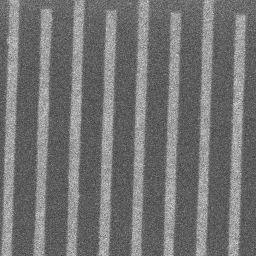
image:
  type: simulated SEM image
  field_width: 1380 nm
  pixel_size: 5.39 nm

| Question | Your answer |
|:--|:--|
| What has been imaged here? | parallel lines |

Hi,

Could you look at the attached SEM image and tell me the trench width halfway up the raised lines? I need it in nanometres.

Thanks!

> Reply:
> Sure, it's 115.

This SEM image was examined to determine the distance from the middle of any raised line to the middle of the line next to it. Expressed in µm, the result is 0.175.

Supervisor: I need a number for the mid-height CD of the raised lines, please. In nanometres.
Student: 62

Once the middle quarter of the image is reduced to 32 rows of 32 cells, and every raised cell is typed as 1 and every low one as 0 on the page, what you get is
00111000001110000011100000111000
00111000001110000011100000111000
00111000001110000011100000111000
00111000001110000011100000111000
00111000001110000011100000111000
00111000001110000011100000111000
00110000001100000011100000111000
00110000001100000011100000111000
00110000001100000011100000111000
00110000001100000011100000111000
00110000001100000011100000111000
00110000001100000011100000111000
00110000001100000011100000111000
00110000001100000011000000110000
00110000001100000011000000110000
00110000001100000011000000110000
00110000001100000011000000110000
01110000011100000011000000110000
01110000011100000011000000110000
01110000011100000011000000110000
01110000011100000011000000110000
01110000011100000011000000110000
01110000011100000011000000110000
01110000011100000011000000110000
01110000011100000111000001110000
01110000011100000111000001110000
01110000011100000111000001110000
01110000011100000111000001110000
01110000011100000111000001110000
01110000011100000111000001110000
01110000011100000111000001110000
01110000011100000111000001110000